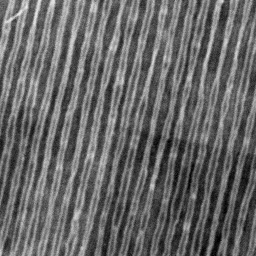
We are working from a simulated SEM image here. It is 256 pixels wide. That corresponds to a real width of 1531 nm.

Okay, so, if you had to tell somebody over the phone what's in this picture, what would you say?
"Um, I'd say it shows parallel lines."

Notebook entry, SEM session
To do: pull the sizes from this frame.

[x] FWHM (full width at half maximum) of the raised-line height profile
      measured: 37.3 nanometres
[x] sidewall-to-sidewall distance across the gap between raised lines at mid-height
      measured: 7.81 pixels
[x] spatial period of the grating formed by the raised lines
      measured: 81.2 nm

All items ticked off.